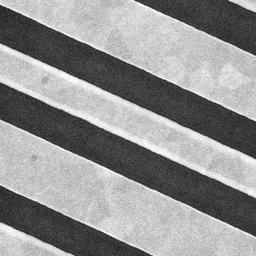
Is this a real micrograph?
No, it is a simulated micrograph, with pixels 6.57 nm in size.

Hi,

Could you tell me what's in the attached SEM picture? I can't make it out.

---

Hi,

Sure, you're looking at lines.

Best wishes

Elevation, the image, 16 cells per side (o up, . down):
.oooooooo.......
...ooooooooo....
.....ooooooooo..
oo.....ooooooooo
oooo.....ooooooo
.ooooo.....ooooo
...ooooo......oo
.....ooooo......
oo......ooooo...
oooo......ooooo.
ooooooo.....oooo
ooooooooo.....oo
..ooooooooo.....
....ooooooooo...
o.....ooooooooo.
ooo......ooooooo